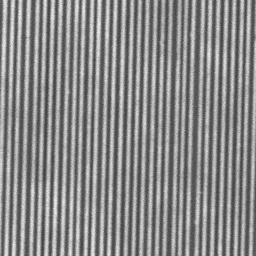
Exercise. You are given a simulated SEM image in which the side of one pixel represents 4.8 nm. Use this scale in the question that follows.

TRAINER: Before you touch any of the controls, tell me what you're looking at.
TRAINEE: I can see parallel lines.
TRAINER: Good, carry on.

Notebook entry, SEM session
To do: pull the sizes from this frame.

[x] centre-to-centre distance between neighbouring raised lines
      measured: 37.8 nanometres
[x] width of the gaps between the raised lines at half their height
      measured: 18 nm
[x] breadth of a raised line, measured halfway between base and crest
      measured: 0.0186 micrometres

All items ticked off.